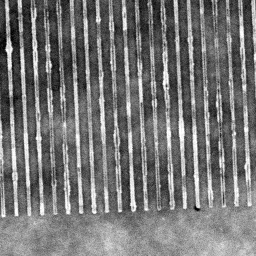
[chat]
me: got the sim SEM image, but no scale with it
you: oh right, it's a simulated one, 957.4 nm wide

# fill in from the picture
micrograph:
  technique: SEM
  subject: parallel lines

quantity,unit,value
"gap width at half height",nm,36.4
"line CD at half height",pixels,2.99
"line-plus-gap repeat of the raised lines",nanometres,48.5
